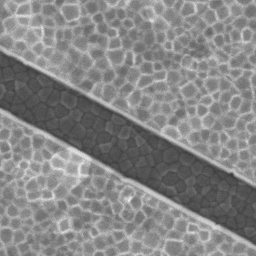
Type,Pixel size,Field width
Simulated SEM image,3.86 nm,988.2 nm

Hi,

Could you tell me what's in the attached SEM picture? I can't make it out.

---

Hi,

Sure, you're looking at one or a few lines or trenches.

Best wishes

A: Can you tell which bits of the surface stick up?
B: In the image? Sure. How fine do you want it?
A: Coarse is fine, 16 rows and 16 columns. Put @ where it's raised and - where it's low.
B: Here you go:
@@@@@@@@@@@@@@@@
@@@@@@@@@@@@@@@@
@@@@@@@@@@@@@@@@
-@@@@@@@@@@@@@@@
---@@@@@@@@@@@@@
-----@@@@@@@@@@@
-------@@@@@@@@@
@-------@@@@@@@@
@@@-------@@@@@@
@@@@@-------@@@@
@@@@@@@-------@@
@@@@@@@@--------
@@@@@@@@@@------
@@@@@@@@@@@@----
@@@@@@@@@@@@@@--
@@@@@@@@@@@@@@@@